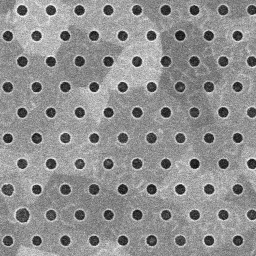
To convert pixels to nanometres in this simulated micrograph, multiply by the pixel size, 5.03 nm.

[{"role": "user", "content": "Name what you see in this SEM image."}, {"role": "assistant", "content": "a regular array of holes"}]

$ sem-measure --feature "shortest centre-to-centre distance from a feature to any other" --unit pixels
28.6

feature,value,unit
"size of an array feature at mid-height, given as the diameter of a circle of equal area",53.8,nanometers